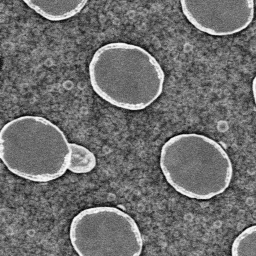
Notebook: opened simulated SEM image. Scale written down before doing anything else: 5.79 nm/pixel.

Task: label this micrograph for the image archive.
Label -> raised bodies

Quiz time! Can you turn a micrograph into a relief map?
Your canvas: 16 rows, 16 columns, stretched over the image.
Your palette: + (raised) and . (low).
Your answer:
..+++......+++++
............+++.
................
......+++.......
......++++......
......++++......
.......++.......
.++.............
++++.......++...
++++......++++..
.+++......++++..
...........+++..
................
.....+++........
....+++++......+
.....++++......+